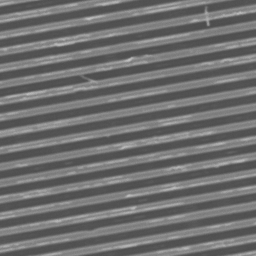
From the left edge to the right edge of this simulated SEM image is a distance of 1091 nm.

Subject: parallel lines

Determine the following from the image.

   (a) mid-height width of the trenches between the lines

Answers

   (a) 0.0378 µm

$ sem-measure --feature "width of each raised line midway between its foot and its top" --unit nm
29.4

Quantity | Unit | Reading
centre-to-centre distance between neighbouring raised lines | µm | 0.0689